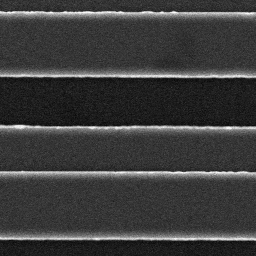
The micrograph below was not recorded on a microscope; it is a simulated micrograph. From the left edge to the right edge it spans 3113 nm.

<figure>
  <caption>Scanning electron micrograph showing lines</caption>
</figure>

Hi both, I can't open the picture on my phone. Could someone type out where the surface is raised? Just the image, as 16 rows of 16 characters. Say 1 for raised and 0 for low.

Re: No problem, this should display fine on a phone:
1111111111111111
1111111111111111
1111111111111111
1111111111111111
1111111111111111
0000000000000000
0000000000000000
0000000000000000
1111111111111111
1111111111111111
1111111111111111
1111111111111111
1111111111111111
1111111111111111
1111111111111111
0000000000000000